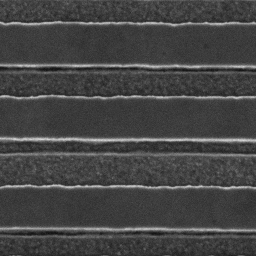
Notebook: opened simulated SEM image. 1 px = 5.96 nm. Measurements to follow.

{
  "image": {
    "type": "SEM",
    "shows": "lines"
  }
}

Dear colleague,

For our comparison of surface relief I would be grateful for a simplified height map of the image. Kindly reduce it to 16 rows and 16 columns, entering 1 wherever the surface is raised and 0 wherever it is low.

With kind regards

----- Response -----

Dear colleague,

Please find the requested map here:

0000000000000000
1111111111111111
1111111111111111
1111111111111111
0000000000000000
0000000000000000
1111111111111111
1111111111111111
1111111111111111
0000000000000000
0000000000000000
0000000000000000
1111111111111111
1111111111111111
0000000000000000
0000000000000000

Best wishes